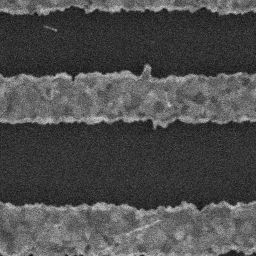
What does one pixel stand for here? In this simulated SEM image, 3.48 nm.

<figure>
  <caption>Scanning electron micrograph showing one or a few lines or trenches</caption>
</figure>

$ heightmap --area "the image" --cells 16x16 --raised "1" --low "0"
1111011111111111
0000000000000000
0000000000000000
0000000000000000
0000000000000000
1111111111111111
1111111111111111
1111111001101110
0000000000000000
0000000000000000
0000000000000000
0000000000000000
0000000000000000
1111111111111111
1111111111111111
1111111111111111